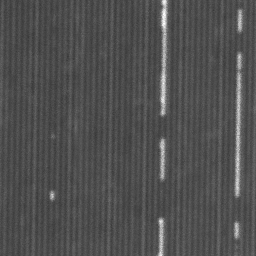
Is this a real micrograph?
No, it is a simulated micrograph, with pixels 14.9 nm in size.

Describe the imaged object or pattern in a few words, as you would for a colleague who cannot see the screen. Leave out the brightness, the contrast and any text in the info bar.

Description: parallel lines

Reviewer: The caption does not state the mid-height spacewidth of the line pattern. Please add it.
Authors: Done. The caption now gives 63.2 nm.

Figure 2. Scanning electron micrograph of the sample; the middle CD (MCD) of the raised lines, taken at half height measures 24.2 nm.